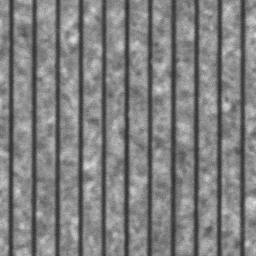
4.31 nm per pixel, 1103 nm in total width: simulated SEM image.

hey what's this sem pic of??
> parallel lines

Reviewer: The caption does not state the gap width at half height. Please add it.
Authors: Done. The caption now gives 22.1 nm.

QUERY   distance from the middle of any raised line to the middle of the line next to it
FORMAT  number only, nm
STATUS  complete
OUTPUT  99.8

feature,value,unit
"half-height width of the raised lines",77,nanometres